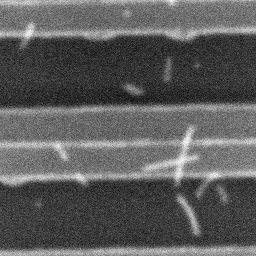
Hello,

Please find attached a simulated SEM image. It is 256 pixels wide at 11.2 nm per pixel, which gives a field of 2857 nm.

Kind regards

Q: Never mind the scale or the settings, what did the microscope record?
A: lines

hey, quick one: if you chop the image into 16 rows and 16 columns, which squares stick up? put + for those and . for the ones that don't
++++++++++++++++
++++++++++++++++
................
................
................
................
................
++++++++++++++++
++++++++++++++++
++++++++++++++++
++++++++++++++++
................
................
................
................
................